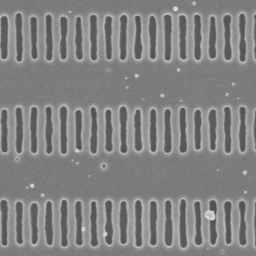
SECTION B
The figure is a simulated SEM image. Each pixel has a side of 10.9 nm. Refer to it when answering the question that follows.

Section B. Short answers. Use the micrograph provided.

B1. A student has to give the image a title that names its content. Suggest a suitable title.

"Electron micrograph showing a regular array of holes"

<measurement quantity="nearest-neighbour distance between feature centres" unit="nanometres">162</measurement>